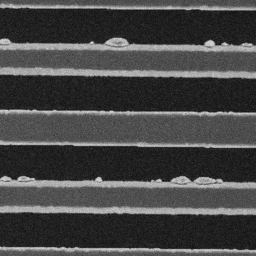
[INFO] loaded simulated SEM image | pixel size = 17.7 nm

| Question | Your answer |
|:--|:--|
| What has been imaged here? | lines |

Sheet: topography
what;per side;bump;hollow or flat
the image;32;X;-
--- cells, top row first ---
XXXXXXXXXXXXXXXXXXXXXXXXXXXXXXXX
--------------------------------
--------------------------------
--------------------------------
--------------------------------
X-------------XX----------------
XXXXXXXXXXXXXXXXXXXXXXXXXXXXXXXX
XXXXXXXXXXXXXXXXXXXXXXXXXXXXXXXX
XXXXXXXXXXXXXXXXXXXXXXXXXXXXXXXX
--------------------------------
--------------------------------
--------------------------------
--------------------------------
--------------------------------
XXXXXXXXXXXXXXXXXXXXXXXXXXXXXXXX
XXXXXXXXXXXXXXXXXXXXXXXXXXXXXXXX
XXXXXXXXXXXXXXXXXXXXXXXXXXXXXXXX
XXXXXXXXXXXXXXXXXXXXXXXXXXXXXXXX
--------------------------------
--------------------------------
--------------------------------
--------------------------------
----------------------X--X------
XXXXXXXXXXXXXXXXXXXXXXXXXXXXXXXX
XXXXXXXXXXXXXXXXXXXXXXXXXXXXXXXX
XXXXXXXXXXXXXXXXXXXXXXXXXXXXXXXX
----------------------------X---
--------------------------------
--------------------------------
--------------------------------
--------------------------------
XXXXXXXXXXXXXXXXXXXXXXXXXXXXXXXX